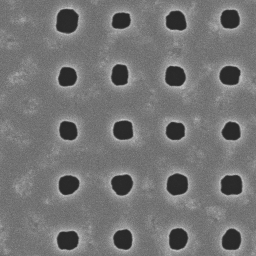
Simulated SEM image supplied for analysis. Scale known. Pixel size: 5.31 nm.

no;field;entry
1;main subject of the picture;a regular array of holes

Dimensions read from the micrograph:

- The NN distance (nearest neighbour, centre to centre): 285 nm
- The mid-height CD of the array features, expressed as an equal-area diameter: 0.11 µm